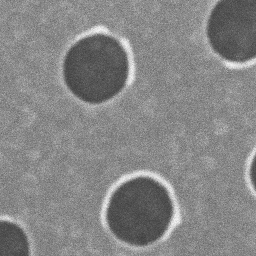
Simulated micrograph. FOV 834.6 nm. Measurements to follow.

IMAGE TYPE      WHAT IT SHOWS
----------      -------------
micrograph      holes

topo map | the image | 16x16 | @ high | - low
@@@@@@@@@@@@@---
@@@@@@@@@@@@@---
@@@@@--@@@@@@---
@@@@----@@@@@@--
@@@@----@@@@@@@@
@@@@----@@@@@@@@
@@@@@@@@@@@@@@@@
@@@@@@@@@@@@@@@@
@@@@@@@@@@@@@@@@
@@@@@@@@@@@@@@@@
@@@@@@@@@@@@@@@@
@@@@@@@@--@@@@@@
@@@@@@@----@@@@@
@@@@@@@----@@@@@
-@@@@@@---@@@@@@
--@@@@@@@@@@@@@@